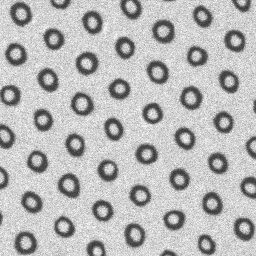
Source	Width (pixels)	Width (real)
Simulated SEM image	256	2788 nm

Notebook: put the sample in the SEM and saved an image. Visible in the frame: a regular array of ring-shaped grooves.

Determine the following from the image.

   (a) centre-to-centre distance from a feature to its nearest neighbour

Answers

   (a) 0.442 micrometres